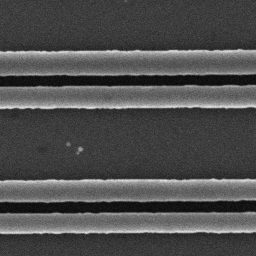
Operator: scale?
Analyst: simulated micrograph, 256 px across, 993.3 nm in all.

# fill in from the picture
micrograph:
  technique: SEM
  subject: lines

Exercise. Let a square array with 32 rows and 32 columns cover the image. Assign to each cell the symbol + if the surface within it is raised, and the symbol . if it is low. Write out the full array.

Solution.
................................
................................
................................
................................
................................
................................
++++++++++++++++++++++++++++++++
++++++++++++++++++++++++++++++++
++++++++++++++++++++++++++++++++
................................
................................
++++++++++++++++++++++++++++++++
++++++++++++++++++++++++++++++++
+++.+++...++..+.................
................................
................................
................................
................................
................................
................................
................................
................................
..........................++....
++++++++++++++++++++++++++++++++
++++++++++++++++++++++++++++++++
................................
................................
++++++++++++++++++++++++++++++++
++++++++++++++++++++++++++++++++
................................
................................
................................